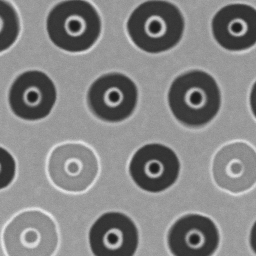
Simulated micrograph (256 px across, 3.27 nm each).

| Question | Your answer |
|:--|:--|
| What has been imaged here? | ring-shaped grooves with a dot in the middle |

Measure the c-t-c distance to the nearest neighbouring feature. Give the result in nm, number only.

262